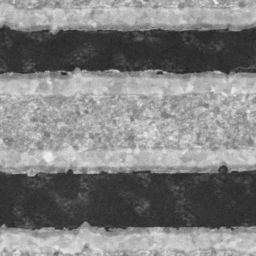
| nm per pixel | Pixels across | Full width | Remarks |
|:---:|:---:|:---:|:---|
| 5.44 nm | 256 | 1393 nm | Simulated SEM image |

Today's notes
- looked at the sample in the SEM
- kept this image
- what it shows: one or a few lines or trenches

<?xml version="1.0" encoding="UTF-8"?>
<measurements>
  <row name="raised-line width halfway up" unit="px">70.5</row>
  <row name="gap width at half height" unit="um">0.417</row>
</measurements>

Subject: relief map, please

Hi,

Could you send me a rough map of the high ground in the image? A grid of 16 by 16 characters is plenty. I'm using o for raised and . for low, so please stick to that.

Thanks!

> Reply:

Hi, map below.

oooooooooooooooo
................
................
................
................
o...oooooooooooo
oooooooooooooooo
oooooooooooooooo
oooooooooooooooo
oooooooooooooooo
................
................
................
................
................
oooooooooooooooo